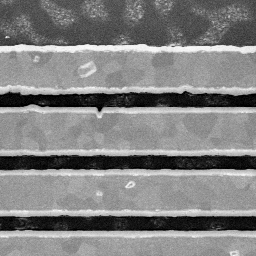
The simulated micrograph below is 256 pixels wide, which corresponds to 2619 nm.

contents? one or a few lines or trenches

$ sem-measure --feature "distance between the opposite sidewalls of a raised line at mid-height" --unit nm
440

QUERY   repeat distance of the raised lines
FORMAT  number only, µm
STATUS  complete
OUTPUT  0.631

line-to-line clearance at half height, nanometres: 193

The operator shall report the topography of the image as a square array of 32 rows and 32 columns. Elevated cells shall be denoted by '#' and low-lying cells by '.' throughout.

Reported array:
................................
................................
................................
................................
................................
................................
################################
################################
################################
################################
################################
......#.....................#...
................................
...##...........................
################################
################################
################################
################################
################################
................................
................................
....#.###.#########.##....###.#.
################################
################################
################################
################################
################################
................................
................................
################################
################################
################################